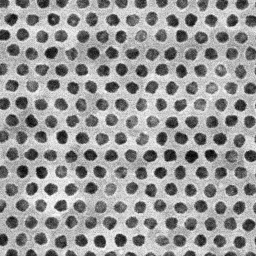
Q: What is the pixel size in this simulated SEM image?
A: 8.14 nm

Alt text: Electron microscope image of a regular array of holes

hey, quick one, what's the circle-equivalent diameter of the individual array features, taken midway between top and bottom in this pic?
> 111 nm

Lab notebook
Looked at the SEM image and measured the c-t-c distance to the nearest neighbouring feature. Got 0.152 micrometres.